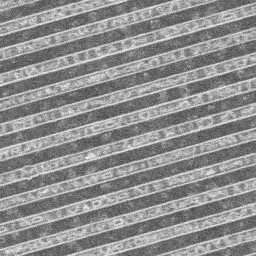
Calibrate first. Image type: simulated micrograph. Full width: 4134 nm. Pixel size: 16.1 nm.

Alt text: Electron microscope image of parallel lines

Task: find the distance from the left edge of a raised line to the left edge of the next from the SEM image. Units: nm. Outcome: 389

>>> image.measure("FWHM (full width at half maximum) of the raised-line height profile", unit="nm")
169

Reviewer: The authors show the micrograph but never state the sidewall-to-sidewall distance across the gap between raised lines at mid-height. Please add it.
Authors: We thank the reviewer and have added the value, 0.216 um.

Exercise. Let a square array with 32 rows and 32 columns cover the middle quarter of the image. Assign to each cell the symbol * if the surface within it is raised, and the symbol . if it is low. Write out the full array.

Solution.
*.............**********........
...........*********............
......***********.............**
...**********.............******
**********............**********
******.............*********....
**.............**********.......
............*********...........
.......***********............**
....**********.............*****
***********............*********
*******.............*********...
***.............**********......
............**********..........
.........*********.............*
.....**********............*****
..*********.............********
********............**********..
****.............*********......
*............**********.........
..........*********.............
......**********............****
..**********.............*******
********..............*********.
*****............**********.....
*.............*********.........
...........*********............
........********..............**
....**********............******
**********.............*********
******.............**********...
***............**********.......